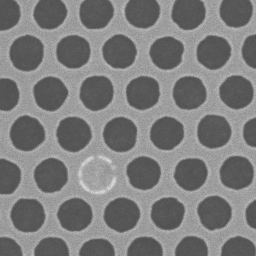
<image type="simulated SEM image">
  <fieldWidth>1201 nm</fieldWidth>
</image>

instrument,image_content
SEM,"a regular array of holes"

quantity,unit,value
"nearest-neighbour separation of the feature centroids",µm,0.216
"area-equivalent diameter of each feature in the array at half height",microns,0.159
